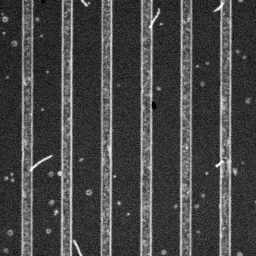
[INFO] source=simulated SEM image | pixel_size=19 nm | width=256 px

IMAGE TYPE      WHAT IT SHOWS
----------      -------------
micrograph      parallel lines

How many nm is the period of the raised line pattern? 755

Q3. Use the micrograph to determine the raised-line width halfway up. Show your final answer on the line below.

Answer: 188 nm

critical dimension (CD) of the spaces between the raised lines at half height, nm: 580